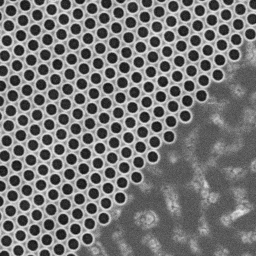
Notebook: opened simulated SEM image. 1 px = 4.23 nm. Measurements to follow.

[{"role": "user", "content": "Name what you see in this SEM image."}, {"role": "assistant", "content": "a regular array of holes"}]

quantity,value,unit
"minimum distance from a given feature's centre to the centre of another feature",63.7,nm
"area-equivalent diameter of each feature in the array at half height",48.9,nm